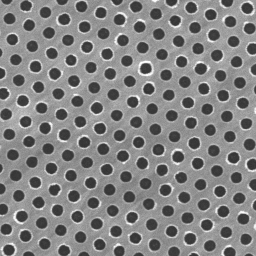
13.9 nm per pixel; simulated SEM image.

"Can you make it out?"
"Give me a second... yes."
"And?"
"a regular array of holes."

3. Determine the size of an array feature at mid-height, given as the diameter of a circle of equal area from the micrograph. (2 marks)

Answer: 164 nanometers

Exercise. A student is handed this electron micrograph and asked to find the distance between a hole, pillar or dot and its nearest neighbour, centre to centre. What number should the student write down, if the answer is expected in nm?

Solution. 283